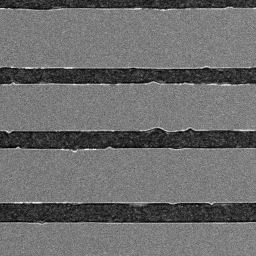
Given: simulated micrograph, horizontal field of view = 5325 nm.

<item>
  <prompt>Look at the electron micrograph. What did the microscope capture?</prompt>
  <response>one or a few lines or trenches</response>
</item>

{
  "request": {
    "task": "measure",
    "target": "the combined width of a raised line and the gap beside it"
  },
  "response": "1.43 µm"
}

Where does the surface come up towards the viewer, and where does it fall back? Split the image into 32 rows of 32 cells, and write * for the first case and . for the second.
................................
********************************
********************************
********************************
********************************
********************************
********************************
********************************
.............*****..............
................................
.*.............******.**........
********************************
********************************
********************************
********************************
********************************
................................
................................
................................
********************************
********************************
********************************
********************************
********************************
********************************
................................
................................
................................
********************************
********************************
********************************
********************************